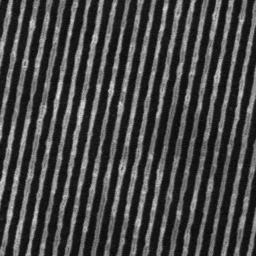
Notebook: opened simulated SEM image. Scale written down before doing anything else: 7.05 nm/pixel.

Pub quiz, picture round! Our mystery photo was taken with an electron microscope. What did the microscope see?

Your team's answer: parallel lines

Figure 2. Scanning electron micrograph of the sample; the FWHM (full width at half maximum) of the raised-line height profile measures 24.3 nanometres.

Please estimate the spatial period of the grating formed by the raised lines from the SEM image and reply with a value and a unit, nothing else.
12.8 px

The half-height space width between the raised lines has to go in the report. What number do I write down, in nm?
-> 65